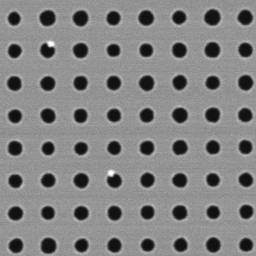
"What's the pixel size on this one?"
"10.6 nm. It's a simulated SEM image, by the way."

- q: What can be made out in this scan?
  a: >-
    a regular array of holes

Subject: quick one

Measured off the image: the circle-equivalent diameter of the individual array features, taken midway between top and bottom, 158 nm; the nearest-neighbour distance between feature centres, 32.3 pixels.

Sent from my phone